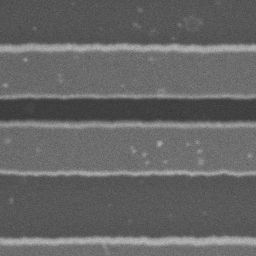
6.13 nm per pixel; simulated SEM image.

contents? lines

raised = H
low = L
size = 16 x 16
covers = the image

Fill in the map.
LLLLLLLLLLLLLLLL
LLLLLLLLLLLLLLLL
LLLLLLLLLLLLLLLL
HHHHHHHHHHHHHHHH
HHHHHHHHHHHHHHHH
HHHHHHHHHHHHHHHH
LLLLLLLLLLLLLLLL
LLLLLLLLLLLLLLLL
HHHHHHHHHHHHHHHH
HHHHHHHHHHHHHHHH
HHHHHHHHHHHHHHHH
LLLLLLLLLLLLLLLL
LLLLLLLLLLLLLLLL
LLLLLLLLLLLLLLLL
LLLLLLLLLLLLLLLL
HHHHHHHHHHHHHHHH